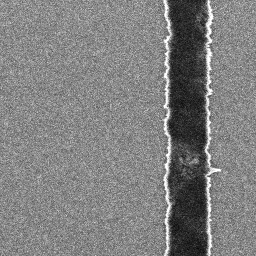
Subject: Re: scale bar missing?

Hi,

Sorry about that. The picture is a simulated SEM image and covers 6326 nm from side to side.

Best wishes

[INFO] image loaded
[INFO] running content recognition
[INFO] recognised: one or a few lines or trenches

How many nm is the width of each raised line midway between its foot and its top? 1050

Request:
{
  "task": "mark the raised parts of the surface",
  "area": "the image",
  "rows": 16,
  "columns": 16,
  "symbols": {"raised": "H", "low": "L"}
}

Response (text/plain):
LLLLLLLLLLHHHLLL
LLLLLLLLLLHHHLLL
LLLLLLLLLLHHHLLL
LLLLLLLLLLHHHLLL
LLLLLLLLLLHHHLLL
LLLLLLLLLLHHHLLL
LLLLLLLLLLHHHLLL
LLLLLLLLLLHHHLLL
LLLLLLLLLLHHHLLL
LLLLLLLLLLHHHLLL
LLLLLLLLLLHHHLLL
LLLLLLLLLLHHHLLL
LLLLLLLLLLHHHLLL
LLLLLLLLLLHHHLLL
LLLLLLLLLLHHHLLL
LLLLLLLLLLHHHLLL